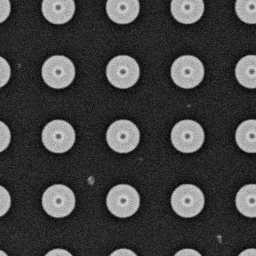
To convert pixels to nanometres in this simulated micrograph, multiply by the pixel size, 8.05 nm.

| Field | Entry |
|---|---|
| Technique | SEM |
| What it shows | an array of small figures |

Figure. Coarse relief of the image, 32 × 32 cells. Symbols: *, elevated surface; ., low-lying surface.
*....****....****....****....***
*....****....****....****.....**
*.....***.....***.....***.....**
................................
................................
................................
................................
*.....***.....***.....***.....**
*....****....****....****....***
*....****....****....****....***
*.....***.....***.....***.....**
................................
................................
................................
................................
*.....***.....***.....***.....**
*....****....****....****.....**
*....****....****....****.....**
*.....***.....***.....***.....**
................................
................................
................................
................................
......***.....***.....***.....**
*....****....****....****.....**
*....****....****....****....***
*.....***.....***.....***.....**
................................
................................
................................
................................
......**......***.....***.....**